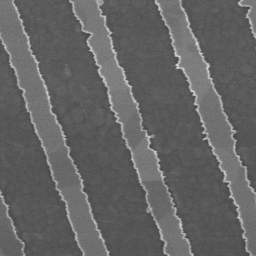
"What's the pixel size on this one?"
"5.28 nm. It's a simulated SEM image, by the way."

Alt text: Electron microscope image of one or a few lines or trenches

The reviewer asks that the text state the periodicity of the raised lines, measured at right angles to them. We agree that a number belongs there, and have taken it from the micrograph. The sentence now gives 417 nm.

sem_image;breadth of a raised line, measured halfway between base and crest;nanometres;119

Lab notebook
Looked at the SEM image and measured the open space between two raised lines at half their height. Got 297 nm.